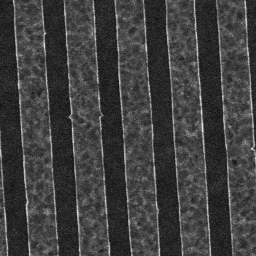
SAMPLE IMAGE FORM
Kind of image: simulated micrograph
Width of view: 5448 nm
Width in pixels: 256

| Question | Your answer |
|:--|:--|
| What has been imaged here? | parallel lines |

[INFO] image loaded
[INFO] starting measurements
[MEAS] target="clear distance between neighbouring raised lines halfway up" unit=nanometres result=465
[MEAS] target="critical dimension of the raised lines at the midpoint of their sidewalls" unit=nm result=616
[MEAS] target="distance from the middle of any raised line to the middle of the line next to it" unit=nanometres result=1080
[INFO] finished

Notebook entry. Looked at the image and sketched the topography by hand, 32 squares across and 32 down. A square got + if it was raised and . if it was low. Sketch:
..+++...++++..++++...+++...++++.
..+++...++++..++++...+++...++++.
..+++...++++...+++...+++...++++.
..+++...++++...+++...+++...++++.
..++++..++++...+++...++++..++++.
..++++..++++...+++...++++..++++.
..++++..++++...+++...++++...+++.
..++++..++++...+++...++++...+++.
..++++...+++...+++...++++...+++.
..++++...+++...+++...++++...+++.
..++++...+++...++++..++++...+++.
..++++...+++...++++..++++...+++.
...+++...+++...++++...+++...+++.
...+++...+++...++++...+++...+++.
...+++...++++..++++...+++...+++.
...+++...++++..++++...+++...++++
...+++...++++..++++...+++...++++
...+++...++++..++++...+++...++++
...+++...++++...+++...+++...++++
...+++...++++...+++...++++..++++
...++++..++++...+++...++++..++++
...++++..++++...+++...++++..++++
...++++..++++...+++...++++...+++
...++++...+++...+++...++++...+++
...++++...+++...++++..++++...+++
...++++...+++...++++..++++...+++
+..++++...+++...++++..++++...+++
+...+++...+++...++++..++++...+++
+...+++...+++...++++...+++...+++
+...+++...++++..++++...+++...+++
+...+++...++++..++++...+++...+++
+...+++...++++..++++...+++...+++